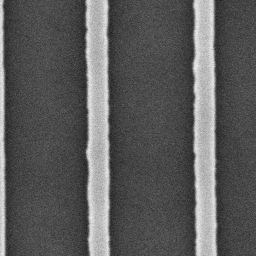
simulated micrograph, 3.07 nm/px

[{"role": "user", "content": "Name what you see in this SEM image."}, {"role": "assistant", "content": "lines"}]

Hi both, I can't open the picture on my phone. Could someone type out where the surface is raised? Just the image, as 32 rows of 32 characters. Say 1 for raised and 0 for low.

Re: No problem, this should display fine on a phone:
00000000000110000000000011100000
00000000000110000000000011100000
00000000000110000000000011100000
00000000000110000000000011100000
00000000000110000000000011100000
00000000000110000000000011100000
00000000000110000000000011100000
00000000000110000000000011100000
00000000000110000000000011100000
00000000000110000000000011100000
00000000000110000000000011100000
00000000000110000000000011100000
00000000000110000000000011100000
00000000000111000000000011100000
00000000000110000000000011100000
00000000000111000000000011100000
00000000000111000000000011100000
00000000000111000000000011100000
00000000000111000000000011100000
00000000000111000000000011100000
00000000000111000000000011100000
00000000000111000000000011100000
00000000000111000000000011100000
00000000000111000000000011100000
10000000000111000000000011100000
00000000000111000000000001100000
10000000000111000000000001100000
10000000000111000000000001100000
10000000000111000000000001100000
10000000000111000000000001100000
10000000000111000000000001100000
10000000000111000000000001100000